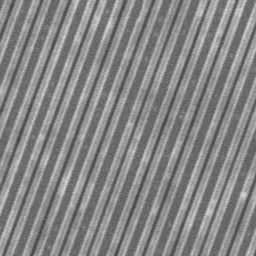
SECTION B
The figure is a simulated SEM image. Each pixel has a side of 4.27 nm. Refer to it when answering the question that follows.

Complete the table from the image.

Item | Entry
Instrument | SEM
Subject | parallel lines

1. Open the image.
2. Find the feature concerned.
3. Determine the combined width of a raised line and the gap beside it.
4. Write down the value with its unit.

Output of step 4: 55.8 nm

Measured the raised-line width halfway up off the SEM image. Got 0.0246 µm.